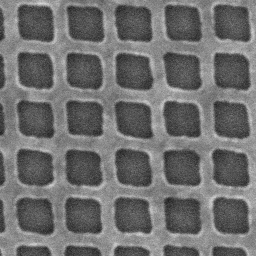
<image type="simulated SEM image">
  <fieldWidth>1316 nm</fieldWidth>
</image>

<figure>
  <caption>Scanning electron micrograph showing a regular array of holes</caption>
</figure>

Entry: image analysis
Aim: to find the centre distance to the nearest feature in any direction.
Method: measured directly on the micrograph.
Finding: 246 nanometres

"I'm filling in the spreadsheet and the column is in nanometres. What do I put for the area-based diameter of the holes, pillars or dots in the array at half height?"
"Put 212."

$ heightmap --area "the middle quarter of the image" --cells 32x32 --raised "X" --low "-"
----------XXX---------XXX-------
----------XXX---------XXX-------
----------XXX---------XXX-------
----------XXX---------XXX-------
X---------XXX---------XXX-------
X---------XXXX--------XXXX------
XXXX----XXXXXXXX-----XXXXXXX----
XXXXXXXXXXXXXXXXXXXXXXXXXXXXXXXX
XXXXXXXXXXXXXXXXXXXXXXXXXXXXXXXX
X--------XXXX-------XXXXX-----XX
----------XX----------XXX-------
----------XX----------XXX-------
X---------XXX---------XXX-------
X---------XXX---------XXX-------
X---------XXX---------XXX-------
X---------XXX---------XXX-------
X---------XXX---------XXX-------
XX--------XXXX--------XXXX------
XXXXXXXXXXXXXXXXX-----XXXXXXXXX-
XXXXXXXXXXXXXXXXXXXXXXXXXXXXXXXX
XXXXXXXXXXXXXXXXXXXXXXXXXXXXXXXX
X----XXXXXXXX-------XXXXX-------
---------XXXX--------XXXX-------
---------XXXX---------XXX-------
---------XXXX---------XXX-------
---------XXXX---------XXX-------
---------XXXX---------XXX-------
----------XXX---------XXX-------
----------XXX---------XXX-------
X---------XXX---------XXXX------
XXX------XXXXXX-------XXXXX-----
XXXXXXXXXXXXXXXXXXXXXXXXXXXXXXXX